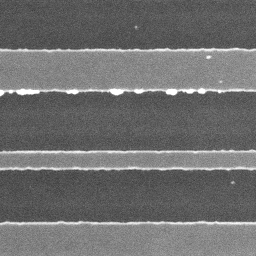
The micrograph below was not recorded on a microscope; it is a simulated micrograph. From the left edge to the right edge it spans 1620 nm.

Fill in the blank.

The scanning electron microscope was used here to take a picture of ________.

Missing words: lines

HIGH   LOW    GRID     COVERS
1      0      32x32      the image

00000000000000000000000000000000
00000000000000000000000000000000
00000000000000000000000000000000
00000000000000000000000000000000
00000000000000000000000000000000
00000000000000000000000000000000
11111111111111111111111111111111
11111111111111111111111111111111
11111111111111111111111111111111
11111111111111111111111111111111
11111111111111111111111111111111
10111000110000100100010101000000
00000000000000000000000000000000
00000000000000000000000000000000
00000000000000000000000000000000
00000000000000000000000000000000
00000000000000000000000000000000
00000000000000000000000000000000
00000000000000000000000000000000
11111111111111111111111111111111
11111111111111111111111111111111
00000000000000000000000000000000
00000000000000000000000000000000
00000000000000000000000000000000
00000000000000000000000000000000
00000000000000000000000000000000
00000000000000000000000000000000
00000000000000000000000000000000
11111111111111111111111111111111
11111111111111111111111111111111
11111111111111111111111111111111
11111111111111111111111111111111